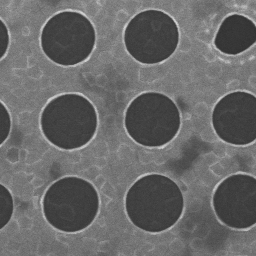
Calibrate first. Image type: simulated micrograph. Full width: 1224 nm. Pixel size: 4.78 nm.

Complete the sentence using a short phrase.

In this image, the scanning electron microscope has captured holes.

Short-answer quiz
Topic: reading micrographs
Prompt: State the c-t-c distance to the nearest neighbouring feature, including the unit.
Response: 397 nanometers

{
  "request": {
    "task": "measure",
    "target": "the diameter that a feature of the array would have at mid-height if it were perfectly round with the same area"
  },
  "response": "260 nanometres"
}